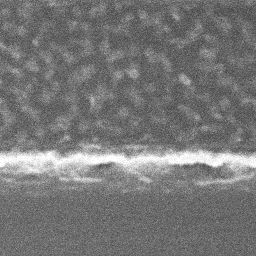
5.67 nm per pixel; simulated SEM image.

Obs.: one or a few lines or trenches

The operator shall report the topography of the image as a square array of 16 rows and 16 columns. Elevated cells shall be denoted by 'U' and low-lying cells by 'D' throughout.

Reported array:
DDDDDDDDDDDDDDDD
DDDDDDDDDDDDDDDD
DDDDDDDDDDDDDDDD
DDDDDDDDDDDDDDDD
DDDDDDDDDDDDDDDD
DDDDDDDDDDDDDDDD
DDDDDDDDDDDDDDDD
DDDDDDDDDDDDDDDD
DDDDDDDDDDDDDDDD
DDDDDDDDDDDDDDDD
UUUUUUUUUUUUUUUU
UUUUUUUUUUUUUUUU
UUUUUUUUUUUUUUUU
UUUUUUUUUUUUUUUU
UUUUUUUUUUUUUUUU
UUUUUUUUUUUUUUUU